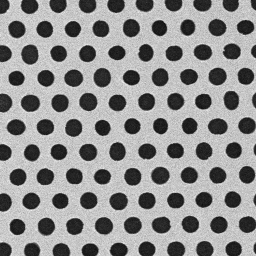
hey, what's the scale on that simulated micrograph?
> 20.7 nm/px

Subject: a regular array of holes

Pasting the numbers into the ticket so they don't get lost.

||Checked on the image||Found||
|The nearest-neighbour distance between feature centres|579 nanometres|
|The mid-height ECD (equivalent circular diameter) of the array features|16.8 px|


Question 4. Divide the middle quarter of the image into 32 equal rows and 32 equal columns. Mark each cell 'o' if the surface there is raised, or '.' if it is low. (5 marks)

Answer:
oooooooooooooooooooooooooooooooo
oo.ooooo...ooooo.oooooo..ooooo..
.....oo.....ooo....ooo....ooo...
.....oo.....ooo....ooo....ooo...
.....ooo...oooo....ooo....oooo..
oo..oooo...ooooooooooooooooooooo
oooooooooooooooooooooooooooooooo
ooooo..ooooooooooooo..ooooo..ooo
.ooo....oooo...oooo...oooo....oo
.ooo....ooo....ooo.....ooo....oo
.ooo....ooo....oooo...oooo....oo
ooooo..ooooo..oooooo..ooooo..ooo
oooooooooooooooooooooooooooooooo
ooooooooooooooooooooooooooooooo.
o...oooo...oooo....oooo...oooo..
.....ooo...oooo....ooo....ooo...
....oooo...oooo....oooo...oooo..
o...ooooo..ooooo..oooooo.oooooo.
oooooooooooooooooooooooooooooooo
oooooooooooooooooooooooooooooooo
oooo...ooooo...oooo...oooo...ooo
.ooo....ooo....oooo....ooo....oo
.ooo....ooo....oooo....ooo....oo
oooo....oooo...oooo...ooooo..ooo
oooooooooooooooooooooooooooooooo
oooooooooooooooooooooooooooooooo
o...ooooo..ooooo...ooo....oooo..
o....ooo....ooo....ooo....ooo...
o....oo.....ooo....ooo....ooo...
o...oooo...oooo....oooo..ooooo..
oooooooooooooooooooooooooooooooo
oooooooooooooooooooooooooooooooo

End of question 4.